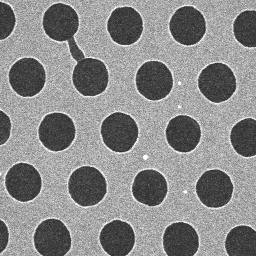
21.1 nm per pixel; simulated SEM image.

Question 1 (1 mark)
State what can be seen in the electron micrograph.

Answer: a regular array of holes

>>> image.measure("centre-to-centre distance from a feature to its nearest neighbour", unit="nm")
1310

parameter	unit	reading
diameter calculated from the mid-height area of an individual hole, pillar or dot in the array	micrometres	0.803